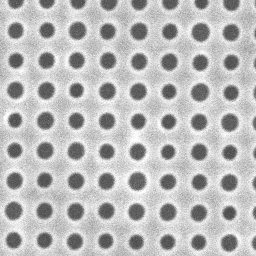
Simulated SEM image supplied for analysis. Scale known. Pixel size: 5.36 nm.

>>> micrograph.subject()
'a regular array of holes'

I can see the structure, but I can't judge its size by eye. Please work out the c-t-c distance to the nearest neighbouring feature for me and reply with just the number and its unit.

29.9 pixels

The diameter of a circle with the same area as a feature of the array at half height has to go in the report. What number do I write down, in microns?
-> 0.0894